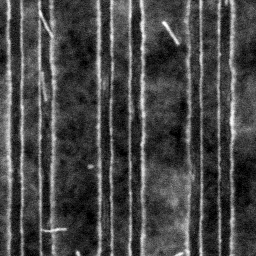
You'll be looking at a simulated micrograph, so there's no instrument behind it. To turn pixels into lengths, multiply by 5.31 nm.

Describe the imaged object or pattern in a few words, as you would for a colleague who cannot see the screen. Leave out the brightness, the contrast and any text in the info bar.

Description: lines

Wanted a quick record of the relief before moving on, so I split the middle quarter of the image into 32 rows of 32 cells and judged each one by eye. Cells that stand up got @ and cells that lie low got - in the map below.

@@@@@@@@@---@@@@@---@@@@@@@@@@@-
@@@@@@@@@---@@@@@---@@@@@@@@@@@-
@@@@@@@@@---@@@@@---@@@@@@@@@@@-
@@@@@@@@@---@@@@@---@@@@@@@@@@@-
@@@@@@@@@---@@@@----@@@@@@@@@@@-
@@@@@@@@@---@@@@----@@@@@@@@@@@-
@@@@@@@@@---@@@@----@@@@@@@@@@@-
@@@@@@@@@---@@@@----@@@@@@@@@@@-
@@@@@@@@@---@@@@---@@@@@@@@@@@@-
@@@@@@@@@---@@@@----@@@@@@@@@@@-
@@@@@@@@@---@@@@----@@@@@@@@@@@-
@@@@@@@@@---@@@@@---@@@@@@@@@@@-
@@@@@@@@@---@@@@@---@@@@@@@@@@@-
@@@@@@@@@---@@@@@---@@@@@@@@@@@-
@@@@@@@@@---@@@@----@@@@@@@@@@@-
@@@@@@@@@---@@@@----@@@@@@@@@@@-
@@@@@@@@@---@@@@----@@@@@@@@@@@-
@@@@@@@@@---@@@@----@@@@@@@@@@@-
@@@@@@@@@---@@@@----@@@@@@@@@@@-
@@@@@@@@@---@@@@----@@@@@@@@@@@-
@@@@@@@@@---@@@@----@@@@@@@@@@@-
@@@@@@@@@---@@@@----@@@@@@@@@@@-
@@@@@@@@@---@@@@----@@@@@@@@@@@-
@@@@@@@@@---@@@@----@@@@@@@@@@@-
@@@@@@@@@---@@@@@---@@@@@@@@@@@-
@@@@@@@@@---@@@@@---@@@@@@@@@@@-
@@@@@@@@@---@@@@@---@@@@@@@@@@@-
@@@@@@@@@---@@@@----@@@@@@@@@@@-
@@@@@@@@@---@@@@@---@@@@@@@@@@@-
@@@@@@@@@---@@@@----@@@@@@@@@@@-
@@@@@@@@@---@@@@----@@@@@@@@@@@-
@@@@@@@@@---@@@@@---@@@@@@@@@@@-